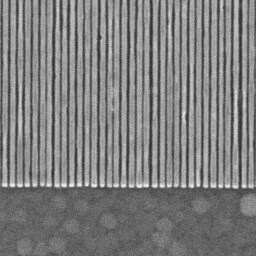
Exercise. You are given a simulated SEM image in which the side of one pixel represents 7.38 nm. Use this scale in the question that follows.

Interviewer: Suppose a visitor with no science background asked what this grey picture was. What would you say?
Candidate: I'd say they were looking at parallel lines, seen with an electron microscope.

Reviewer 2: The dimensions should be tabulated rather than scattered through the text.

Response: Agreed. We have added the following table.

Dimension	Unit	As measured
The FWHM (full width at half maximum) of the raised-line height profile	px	3.88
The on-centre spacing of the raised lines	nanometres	55.1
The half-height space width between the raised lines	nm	22.1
